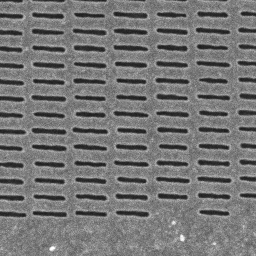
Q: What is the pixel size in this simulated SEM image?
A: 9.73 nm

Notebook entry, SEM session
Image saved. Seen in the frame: a regular array of holes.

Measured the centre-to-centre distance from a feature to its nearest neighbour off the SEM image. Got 160 nm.